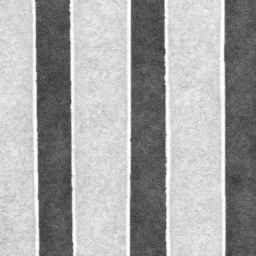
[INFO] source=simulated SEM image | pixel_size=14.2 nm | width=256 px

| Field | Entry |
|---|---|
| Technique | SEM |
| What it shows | lines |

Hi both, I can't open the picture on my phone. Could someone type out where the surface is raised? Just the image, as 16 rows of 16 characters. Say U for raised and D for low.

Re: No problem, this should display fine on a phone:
UUDDDUUUDDUUUUDD
UUDDDUUUDDUUUUDD
UUDDDUUUDDUUUUDD
UUDDDUUUDDUUUUDD
UUDDDUUUDDUUUUDD
UUDDDUUUDDUUUUDD
UUDDDUUUDDUUUUDD
UUDDDUUUDDDUUUDD
UUDDDUUUDDDUUUDD
UUDDDUUUDDDUUUDD
UUDDDUUUDDDUUUDD
UUDDDUUUDDDUUUDD
UUDDDUUUDDDUUUDD
UUDDDUUUDDDUUUDD
UUDDDUUUDDDUUUDD
UUDDDUUUDDDUUUDD